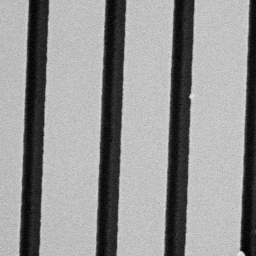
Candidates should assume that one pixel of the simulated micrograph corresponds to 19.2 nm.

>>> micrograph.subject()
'lines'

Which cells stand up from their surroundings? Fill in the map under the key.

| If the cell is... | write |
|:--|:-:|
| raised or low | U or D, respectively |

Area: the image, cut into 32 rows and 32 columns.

UUUUDDUUUUUUUDDDUUUUUUDDUUUUUUUD
UUUUDDUUUUUUUDDDUUUUUUDDUUUUUUUD
UUUUDDUUUUUUUDDDUUUUUUDDUUUUUUUD
UUUDDDUUUUUUUDDDUUUUUUDDUUUUUUUD
UUUDDDUUUUUUUDDDUUUUUUDDUUUUUUUD
UUUDDDUUUUUUUDDDUUUUUUDDUUUUUUUD
UUUDDDUUUUUUUDDDUUUUUUDDUUUUUUUD
UUUDDDUUUUUUUDDUUUUUUDDDUUUUUUUD
UUUDDDUUUUUUUDDUUUUUUDDDUUUUUUUD
UUUDDDUUUUUUUDDUUUUUUDDDUUUUUUUD
UUUDDDUUUUUUUDDUUUUUUDDDUUUUUUUD
UUUDDDUUUUUUUDDUUUUUUDDDUUUUUUUD
UUUDDDUUUUUUUDDUUUUUUDDDUUUUUUUD
UUUDDDUUUUUUUDDUUUUUUDDDUUUUUUUD
UUUDDDUUUUUUUDDUUUUUUDDDUUUUUUUD
UUUDDDUUUUUUUDDUUUUUUDDDUUUUUUUD
UUUDDDUUUUUUUDDUUUUUUDDDUUUUUUDD
UUUDDDUUUUUUUDDUUUUUUDDDUUUUUUDD
UUUDDUUUUUUUDDDUUUUUUDDDUUUUUUDD
UUUDDUUUUUUUDDDUUUUUUDDDUUUUUUDD
UUUDDUUUUUUUDDDUUUUUUDDDUUUUUUDD
UUUDDUUUUUUUDDDUUUUUUDDDUUUUUUDD
UUUDDUUUUUUUDDDUUUUUUDDUUUUUUUDD
UUUDDUUUUUUUDDDUUUUUUDDUUUUUUUDD
UUUDDUUUUUUUDDDUUUUUUDDUUUUUUUDD
UUUDDUUUUUUUDDDUUUUUUDDUUUUUUUDD
UUUDDUUUUUUUDDDUUUUUUDDUUUUUUUDD
UUUDDUUUUUUUDDDUUUUUUDDUUUUUUUDD
UUUDDUUUUUUUDDDUUUUUUDDUUUUUUUDD
UUDDDUUUUUUUDDDUUUUUUDDUUUUUUUDD
UUDDDUUUUUUUDDDUUUUUUDDUUUUUUUDD
UUDDDUUUUUUUDDDUUUUUUDDUUUUUUUDD